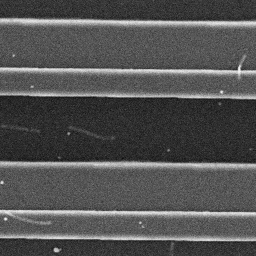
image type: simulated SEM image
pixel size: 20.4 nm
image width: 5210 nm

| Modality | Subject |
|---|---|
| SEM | lines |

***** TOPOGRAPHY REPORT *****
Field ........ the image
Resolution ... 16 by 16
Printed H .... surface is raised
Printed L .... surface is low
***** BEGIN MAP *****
LLLLLLLLLLLLLLLL
HHHHHHHHHHHHHHLL
HHHHHHHHHHHHHHHH
HHHHHHHHHHHHHHHH
HHHHHHHHHHHHHHHH
HHHHHHHHHHHHHHHH
LLLLLLLLLLLLLLLL
LLLLLLLLLLLLLLLL
LLLLLLLLLLLLLLLL
LLLLLLLLLLLLLLLL
HHHHHHHHHHHHHHHH
HHHHHHHHHHHHHHHH
HHHHHHHHHHHHHHHH
HHHHHHHHHHHHHHHH
HHHHHHHHHHHHHHHH
LLLLLLLLLLLLLLLL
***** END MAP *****